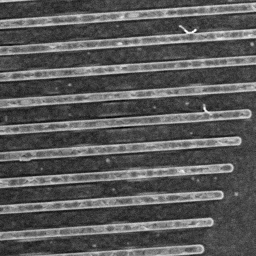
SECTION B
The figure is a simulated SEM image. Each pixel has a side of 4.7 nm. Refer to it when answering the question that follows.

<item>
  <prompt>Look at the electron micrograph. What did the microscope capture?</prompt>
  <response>parallel lines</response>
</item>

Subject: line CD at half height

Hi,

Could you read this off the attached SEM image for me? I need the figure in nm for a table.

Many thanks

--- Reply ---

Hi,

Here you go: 39.2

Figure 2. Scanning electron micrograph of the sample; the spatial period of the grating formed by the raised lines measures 124 nm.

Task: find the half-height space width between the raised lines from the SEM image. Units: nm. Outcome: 82.6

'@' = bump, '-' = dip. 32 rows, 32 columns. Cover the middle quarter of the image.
-----------@@@@@@@@@@@@@@@@@@@@@
@@@@@@@@@@@@@@@@@@@@@@@@--------
@@@@@@@@@-----------------------
--------------------------------
--------------------------------
--------------------------------
---------------------@@@@@@@@@@@
------@@@@@@@@@@@@@@@@@@@@@@@@@@
@@@@@@@@@@@@@@@@@@@-------------
@@@@@---------------------------
--------------------------------
--------------------------------
----------------------------@@@@
--------------@@-@@@@@@@@@@@@@@@
@@@@@@@@@@@@@@@@@@@@@@@@@@@@@@--
@@@@@@@@@@@@@@@-----------------
--------------------------------
--------------------------------
--------------------------------
------------------------@@@@@@@@
---------@@@@@@@@@@@@@@@@@@@@@@@
@@@@@@@@@@@@@@@@@@@@@@@@@@------
@@@@@@@@@@@---------------------
--------------------------------
--------------------------------
--------------------------------
--------------------@@@@@@@@@@@@
--@--@@@@@@@@@@@@@@@@@@@@@@@@@@@
@@@@@@@@@@@@@@@@@@--------------
@@@@@@@-------------------------
--------------------------------
--------------------------------